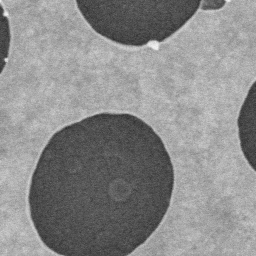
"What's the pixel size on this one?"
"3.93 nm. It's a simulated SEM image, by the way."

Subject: holes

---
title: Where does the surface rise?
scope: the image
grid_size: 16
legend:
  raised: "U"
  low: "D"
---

UUUUUDDDDDDDDDUU
DUUUUUDDDDDDUUUU
DUUUUUUDDDUUUUUU
UUUUUUUUUUUUUUUU
UUUUUUUUUUUUUUUU
UUUUUUUUUUUUUUUU
UUUUUUUUUUUUUUUD
UUUUUDDDDUUUUUUD
UUUDDDDDDDUUUUUD
UUUDDDDDDDUUUUUD
UUDDDDDDDDDUUUUU
UUDDDDDDDDDUUUUU
UUDDDDDDDDDUUUUU
UUDDDDDDDDUUUUUU
UUDDDDDDDDUUUUUU
UUUDDDDDDUUUUUUU